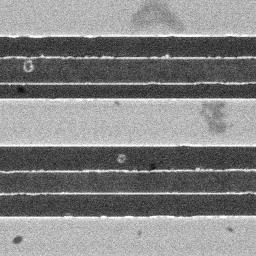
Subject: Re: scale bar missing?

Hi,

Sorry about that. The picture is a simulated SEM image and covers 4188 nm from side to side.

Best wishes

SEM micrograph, lines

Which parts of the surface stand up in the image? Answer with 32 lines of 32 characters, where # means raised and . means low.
################################
################################
################################
################################
.#####....##....................
................................
................................
################################
################################
################################
................................
................................
################################
################################
################################
################################
################################
################################
................................
................................
................................
################################
################################
################################
................................
................................
................................
################################
################################
################################
################################
################################